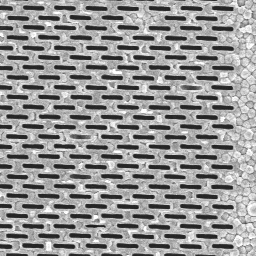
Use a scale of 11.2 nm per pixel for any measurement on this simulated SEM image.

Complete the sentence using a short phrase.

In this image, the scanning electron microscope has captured a regular array of holes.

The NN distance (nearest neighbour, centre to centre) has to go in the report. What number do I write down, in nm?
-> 203